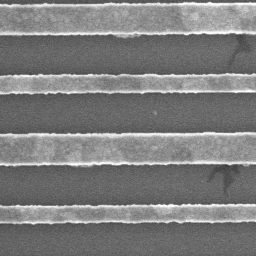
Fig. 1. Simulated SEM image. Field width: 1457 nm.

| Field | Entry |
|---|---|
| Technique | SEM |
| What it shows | lines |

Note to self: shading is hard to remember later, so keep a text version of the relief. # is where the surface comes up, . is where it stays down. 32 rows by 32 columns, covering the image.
.............###..##.#######.###
################################
################################
################################
................................
................................
................................
................................
................................
################################
################################
##################..#..##....#..
................................
................................
................................
................................
................................
################################
################################
################################
######.####...#.#...............
................................
................................
................................
................................
................................
################################
################################
................................
................................
................................
................................